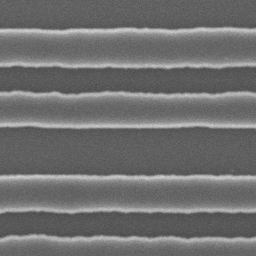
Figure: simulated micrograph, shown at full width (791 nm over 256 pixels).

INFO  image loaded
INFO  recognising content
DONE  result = lines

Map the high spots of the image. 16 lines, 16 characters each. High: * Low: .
................
................
****************
****************
................
................
****************
****************
................
................
................
****************
****************
................
................
****************